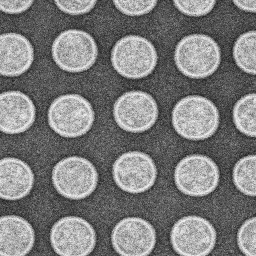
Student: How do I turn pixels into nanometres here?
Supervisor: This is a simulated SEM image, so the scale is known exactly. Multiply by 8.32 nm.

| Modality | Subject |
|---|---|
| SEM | a regular array of raised bodies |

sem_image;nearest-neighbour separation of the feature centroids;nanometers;498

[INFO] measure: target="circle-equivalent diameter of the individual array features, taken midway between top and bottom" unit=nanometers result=346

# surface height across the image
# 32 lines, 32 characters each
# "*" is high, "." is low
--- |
****...*****...****...*****...**
.*.......*......**.....***......
................................
................................
**.....****...................**
***....*****...****...*****...**
****...*****..*****...*****..***
****...*****..*****...*****..***
***.....***....****...*****...**
................**......*.......
................................
................................
****...***.....****....***....**
****..*****...******..*****..***
****..*****...******..*****..***
****..*****....****...*****...**
.*.....***............*****....*
................................
................................
...............***..............
***....****...*****....****...**
****...*****..*****...*****..***
****...*****...****...*****..***
****...*****...***.....****...**
***.....***.....................
................................
................................
***.....**......**.....***.....*
****...****....****...****....**
****..******..*****...*****...**
****...*****..*****...*****...**
***....****....****...****.....*